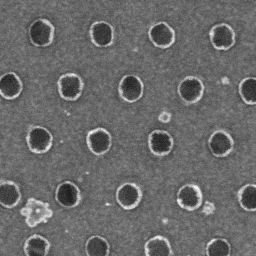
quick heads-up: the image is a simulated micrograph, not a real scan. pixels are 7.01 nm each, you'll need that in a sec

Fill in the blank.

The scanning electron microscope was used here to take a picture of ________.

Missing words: a regular array of raised bodies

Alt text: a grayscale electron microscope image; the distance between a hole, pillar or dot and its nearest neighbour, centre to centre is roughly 0.421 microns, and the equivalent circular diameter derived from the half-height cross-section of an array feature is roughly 174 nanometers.